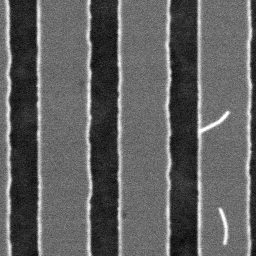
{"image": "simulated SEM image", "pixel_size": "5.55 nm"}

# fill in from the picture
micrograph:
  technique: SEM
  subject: lines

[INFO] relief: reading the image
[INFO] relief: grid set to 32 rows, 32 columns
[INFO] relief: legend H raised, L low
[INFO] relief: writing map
HLLLLHHHHHHLLLLHHHHHHLLLLHHHHHHL
HLLLLHHHHHHLLLLHHHHHHLLLLHHHHHHL
HLLLLHHHHHHLLLLHHHHHHLLLLHHHHHHL
HLLLLHHHHHHLLLLHHHHHHLLLLHHHHHHL
HLLLLHHHHHHLLLLHHHHHHLLLLHHHHHHL
HLLLLHHHHHHLLLLHHHHHHLLLLHHHHHHL
HLLLLHHHHHHLLLLHHHHHHLLLLHHHHHHL
HLLLLHHHHHHLLLLHHHHHHLLLLHHHHHHL
HLLLLHHHHHHLLLLHHHHHHLLLLHHHHHHL
HLLLLHHHHHHLLLLHHHHHHLLLLHHHHHHL
HLLLLHHHHHHLLLLHHHHHHLLLLHHHHHHL
HLLLLHHHHHHLLLLHHHHHHLLLLHHHHHHL
HLLLLHHHHHHLLLLHHHHHHLLLLHHHHHHL
HLLLLHHHHHHLLLLHHHHHHLLLLHHHHHHL
HLLLLHHHHHHLLLLHHHHHHLLLLHHHHHHL
HLLLLHHHHHHLLLLHHHHHHLLLLHHHHHHL
HLLLLHHHHHHLLLLHHHHHHLLLLHHHHHHL
HLLLLHHHHHHLLLLHHHHHHLLLLHHHHHHL
HLLLLHHHHHHLLLLHHHHHHLLLLHHHHHHL
HLLLLHHHHHHLLLLHHHHHHLLLLHHHHHHL
HLLLLHHHHHHLLLLHHHHHHLLLLHHHHHHL
HLLLLHHHHHHLLLLHHHHHHLLLLHHHHHHL
HLLLLHHHHHHLLLLHHHHHHLLLLHHHHHHL
HLLLLHHHHHHLLLLHHHHHHLLLLHHHHHHL
HLLLLHHHHHHLLLLHHHHHHLLLLHHHHHHL
HLLLLHHHHHHLLLLHHHHHHLLLLHHHHHHL
HLLLLHHHHHHLLLLHHHHHHLLLLHHHHHHL
HLLLLHHHHHHLLLLHHHHHHLLLLHHHHHHL
HLLLLHHHHHHLLLLHHHHHHLLLLHHHHHHL
HLLLLHHHHHHLLLLHHHHHHLLLLHHHHHHL
HLLLLHHHHHHLLLLHHHHHHLLLLHHHHHHL
HLLLLHHHHHHLLLLHHHHHHLLLLHHHHHHL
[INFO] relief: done